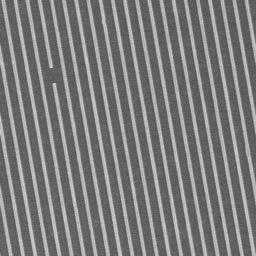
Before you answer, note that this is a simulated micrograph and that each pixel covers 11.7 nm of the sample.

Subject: parallel lines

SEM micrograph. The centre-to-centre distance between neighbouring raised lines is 0.14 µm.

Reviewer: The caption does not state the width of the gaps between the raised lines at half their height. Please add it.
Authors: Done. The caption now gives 105 nanometres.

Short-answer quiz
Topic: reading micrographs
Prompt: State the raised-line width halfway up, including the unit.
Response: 33.1 nm